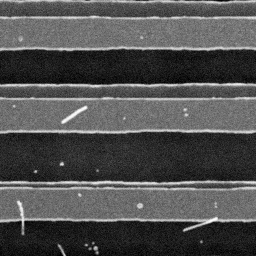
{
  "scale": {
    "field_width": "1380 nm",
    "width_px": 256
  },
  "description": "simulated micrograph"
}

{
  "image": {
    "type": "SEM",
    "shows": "lines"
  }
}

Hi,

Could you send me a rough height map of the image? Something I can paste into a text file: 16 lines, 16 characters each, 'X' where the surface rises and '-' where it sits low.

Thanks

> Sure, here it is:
XXXXXXXXXXXXXXXX
XXXXXXXXXXXXXXXX
XXXXXXXXXXXXXXXX
----------------
----------------
XXXXXXXXXXXXXXXX
XXXXXXXXXXXXXXXX
XXXXXXXXXXXXXXXX
----------------
----------------
----------------
XXXXXXXXXXXXXXXX
XXXXXXXXXXXXXXXX
XXXXXXXXXXXXXXXX
----------------
----------------